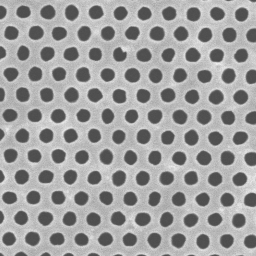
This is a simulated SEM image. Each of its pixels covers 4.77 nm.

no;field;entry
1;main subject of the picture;a regular array of holes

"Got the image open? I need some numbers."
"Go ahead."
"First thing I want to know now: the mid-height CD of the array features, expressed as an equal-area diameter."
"65.6 nm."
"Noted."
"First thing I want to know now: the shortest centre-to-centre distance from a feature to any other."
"111 nanometers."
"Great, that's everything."